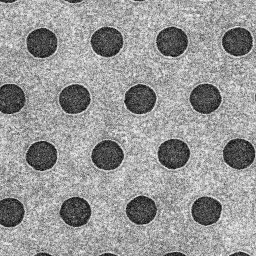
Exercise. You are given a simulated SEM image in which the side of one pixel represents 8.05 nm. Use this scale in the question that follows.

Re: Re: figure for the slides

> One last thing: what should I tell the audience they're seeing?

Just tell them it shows a regular array of holes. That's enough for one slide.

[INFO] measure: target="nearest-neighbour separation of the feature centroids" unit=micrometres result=0.521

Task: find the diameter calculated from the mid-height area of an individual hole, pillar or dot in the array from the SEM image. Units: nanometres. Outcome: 256